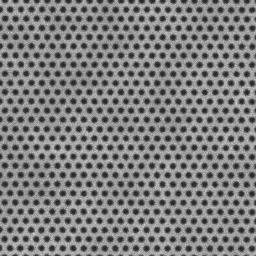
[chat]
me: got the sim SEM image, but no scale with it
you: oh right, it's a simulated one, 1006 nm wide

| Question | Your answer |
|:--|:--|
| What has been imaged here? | a regular array of holes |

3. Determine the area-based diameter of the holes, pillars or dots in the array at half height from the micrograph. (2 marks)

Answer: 24.7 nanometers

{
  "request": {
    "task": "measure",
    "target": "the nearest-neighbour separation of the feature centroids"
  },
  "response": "0.0405 microns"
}